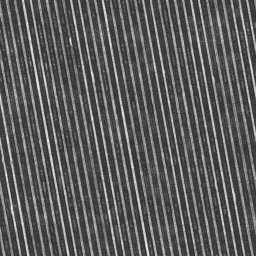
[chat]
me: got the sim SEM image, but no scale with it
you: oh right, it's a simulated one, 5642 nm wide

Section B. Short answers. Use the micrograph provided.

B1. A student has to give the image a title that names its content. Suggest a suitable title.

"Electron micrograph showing parallel lines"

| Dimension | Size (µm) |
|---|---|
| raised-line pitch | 0.174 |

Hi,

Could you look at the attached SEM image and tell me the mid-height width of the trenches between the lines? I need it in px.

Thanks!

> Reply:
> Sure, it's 6.28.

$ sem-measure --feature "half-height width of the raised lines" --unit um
0.038